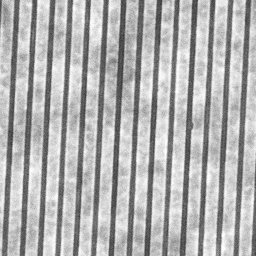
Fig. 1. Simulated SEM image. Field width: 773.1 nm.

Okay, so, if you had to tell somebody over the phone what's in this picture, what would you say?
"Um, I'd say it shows parallel lines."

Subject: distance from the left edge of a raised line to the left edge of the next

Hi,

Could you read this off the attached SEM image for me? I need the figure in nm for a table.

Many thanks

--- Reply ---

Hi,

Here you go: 53.7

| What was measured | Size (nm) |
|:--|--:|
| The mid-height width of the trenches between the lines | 18.5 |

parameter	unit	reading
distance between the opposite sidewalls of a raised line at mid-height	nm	36.6